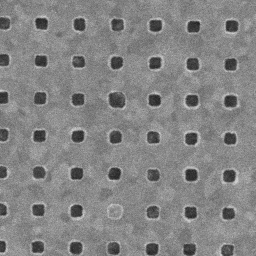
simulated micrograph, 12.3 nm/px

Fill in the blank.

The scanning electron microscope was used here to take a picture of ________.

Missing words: a regular array of holes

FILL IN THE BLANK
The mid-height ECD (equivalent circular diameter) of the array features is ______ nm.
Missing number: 173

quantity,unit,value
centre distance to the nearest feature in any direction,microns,0.456